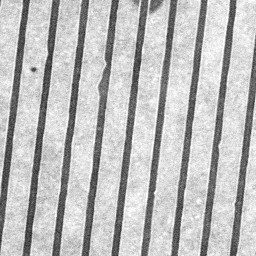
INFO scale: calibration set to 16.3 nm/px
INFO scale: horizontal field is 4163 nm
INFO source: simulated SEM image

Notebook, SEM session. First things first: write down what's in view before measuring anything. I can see parallel lines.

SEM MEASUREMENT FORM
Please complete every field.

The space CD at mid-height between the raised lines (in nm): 123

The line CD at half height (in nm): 353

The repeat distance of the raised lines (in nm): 478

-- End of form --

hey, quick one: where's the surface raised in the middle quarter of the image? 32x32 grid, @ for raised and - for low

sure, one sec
@@@--@@@@@--@@@@@--@@@@@@--@@@@@
@@--@@@@@@--@@@@@--@@@@@---@@@@@
@@--@@@@@@--@@@@@--@@@@@--@@@@@@
@@--@@@@@---@@@@@--@@@@@--@@@@@@
@@--@@@@@---@@@@@--@@@@@--@@@@@@
@@--@@@@---@@@@@@--@@@@@--@@@@@@
@@--@@@@---@@@@@---@@@@@--@@@@@-
@@--@@@@@--@@@@@---@@@@@--@@@@@-
@@--@@@@@--@@@@@--@@@@@@--@@@@@-
@---@@@@@--@@@@@--@@@@@---@@@@@-
@--@@@@@@--@@@@@--@@@@@--@@@@@@-
@--@@@@@---@@@@@--@@@@@--@@@@@@-
@--@@@@@--@@@@@@--@@@@@--@@@@@@-
@--@@@@@--@@@@@@--@@@@@--@@@@@--
@--@@@@@--@@@@@---@@@@@--@@@@@--
@--@@@@@--@@@@@---@@@@@--@@@@@--
---@@@@@--@@@@@---@@@@@--@@@@@--
--@@@@@@--@@@@@--@@@@@@--@@@@@--
--@@@@@@--@@@@@--@@@@@@-@@@@@@--
--@@@@@@--@@@@@--@@@@@@-@@@@@@--
--@@@@@---@@@@@--@@@@@--@@@@@@--
--@@@@@---@@@@@--@@@@@--@@@@@@--
--@@@@@--@@@@@@--@@@@@--@@@@@---
--@@@@@--@@@@@---@@@@@--@@@@@--@
--@@@@@--@@@@@---@@@@@--@@@@@--@
--@@@@@--@@@@@--@@@@@@--@@@@@--@
--@@@@@--@@@@@--@@@@@---@@@@@--@
-@@@@@@--@@@@@--@@@@@---@@@@@--@
--@@@@@--@@@@@--@@@@@---@@@@@--@
-@@@@@--@@@@@@--@@@@@--@@@@@@--@
-@@@@@--@@@@@@--@@@@@--@@@@@---@
-@@@@@--@@@@@---@@@@@--@@@@@--@@